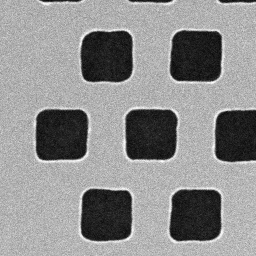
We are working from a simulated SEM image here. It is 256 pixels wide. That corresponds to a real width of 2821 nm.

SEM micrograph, holes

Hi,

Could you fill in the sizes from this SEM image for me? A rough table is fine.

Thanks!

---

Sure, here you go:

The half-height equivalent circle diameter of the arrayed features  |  628 nm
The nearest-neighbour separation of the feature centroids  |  986 nanometres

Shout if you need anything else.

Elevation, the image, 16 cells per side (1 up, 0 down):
1111111111111111
1111111111111111
1111100011100011
1111100011100011
1111100011100011
1111111111111111
1111111111111111
1100001100011100
1100011100011000
1100011100011000
1111111111111111
1111111111111111
1111100011100011
1111100011100011
1111100011100011
1111111111111111